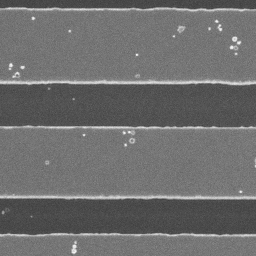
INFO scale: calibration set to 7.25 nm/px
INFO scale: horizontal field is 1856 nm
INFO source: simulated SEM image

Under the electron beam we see lines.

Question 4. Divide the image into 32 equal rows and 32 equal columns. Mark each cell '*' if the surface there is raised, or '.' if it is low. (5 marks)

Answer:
................................
********************************
********************************
********************************
********************************
********************************
********************************
********************************
********************************
********************************
...*........................****
................................
................................
................................
................................
................................
********************************
********************************
********************************
********************************
********************************
********************************
********************************
********************************
********************************
................................
................................
................................
................................
********************************
********************************
********************************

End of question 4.